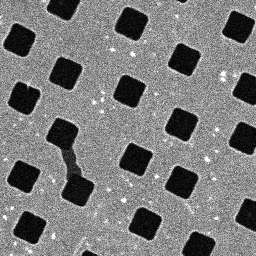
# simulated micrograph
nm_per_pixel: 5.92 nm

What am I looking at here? a regular array of holes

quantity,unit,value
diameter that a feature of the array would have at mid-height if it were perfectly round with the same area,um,0.18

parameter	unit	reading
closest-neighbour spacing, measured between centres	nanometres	327